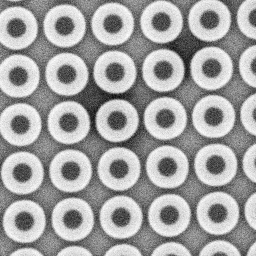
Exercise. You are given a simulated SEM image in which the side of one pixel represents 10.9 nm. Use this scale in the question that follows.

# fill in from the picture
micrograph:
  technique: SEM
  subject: an array of small figures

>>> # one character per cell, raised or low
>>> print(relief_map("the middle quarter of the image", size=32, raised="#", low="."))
#####...##########..##########..
######..##########..##########..
######..##########..##########..
######..##########..##########..
######..#########...#########...
#####....########....#######....
####......######.......####.....
###.............................
........................###.....
.##........#####......#######...
####.....########....#########..
#####....#########...#########..
######..##########..##########..
######..###########.###########.
######..###########.###########.
######..##########..##########..
######...#########...#########..
######...########.....#######...
#####.....######.......####.....
###.............................
................................
...........#####.......######...
#####.....########....########..
######...#########...##########.
######...##########..##########.
#######..##########..##########.
#######..##########..##########.
#######..##########..##########.
#######..#########...#########..
######....########....########..
#####......######.......####....
####............................